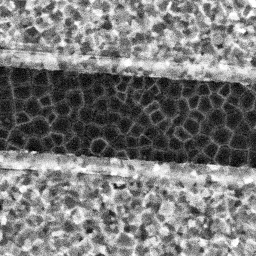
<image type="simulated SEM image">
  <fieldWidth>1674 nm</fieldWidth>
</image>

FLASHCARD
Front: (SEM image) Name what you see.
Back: one or a few lines or trenches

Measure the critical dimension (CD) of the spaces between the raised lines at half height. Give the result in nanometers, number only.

712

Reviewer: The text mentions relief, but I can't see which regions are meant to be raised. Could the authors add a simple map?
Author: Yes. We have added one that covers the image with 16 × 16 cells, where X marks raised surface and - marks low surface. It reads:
XXXXXXXXXXXXXXXX
XXXXXXXXXXXXXXXX
XXXXXXXXXXXXXXXX
--XXXXXXXXXXXXXX
----------------
----------------
----------------
----------------
----------------
----------------
XXXXX-----------
XXXXXXXXXXXXXXXX
XXXXXXXXXXXXXXXX
XXXXXXXXXXXXXXXX
XXXXXXXXXXXXXXXX
XXXXXXXXXXXXXXXX